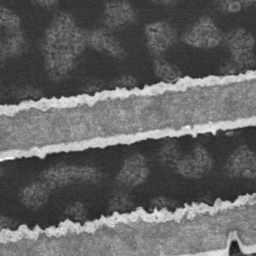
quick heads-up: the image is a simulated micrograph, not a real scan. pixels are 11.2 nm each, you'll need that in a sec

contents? one or a few lines or trenches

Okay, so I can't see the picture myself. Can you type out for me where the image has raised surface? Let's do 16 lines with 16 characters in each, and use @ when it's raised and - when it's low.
----------------
----------------
----------------
----------------
----------------
----------@@@@@@
--@@@@@@@@@@@@@@
@@@@@@@@@@@@@@@@
@@@@@@@@@-------
@@@-------------
----------------
----------------
---------------@
--------@@@@@@@@
--@@@@@@@@@@@@@@
@@@@@@@@@@@@@@-@